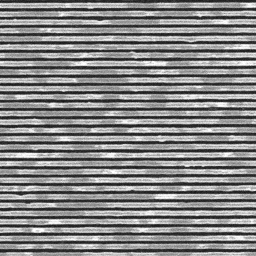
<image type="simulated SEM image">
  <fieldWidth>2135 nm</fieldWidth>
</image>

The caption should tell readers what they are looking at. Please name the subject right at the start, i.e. parallel lines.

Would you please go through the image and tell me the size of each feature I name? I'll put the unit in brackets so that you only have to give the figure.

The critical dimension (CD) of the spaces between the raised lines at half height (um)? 0.0292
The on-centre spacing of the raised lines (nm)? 69.4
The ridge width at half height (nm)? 36.5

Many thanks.